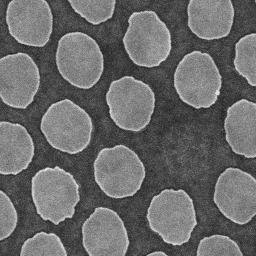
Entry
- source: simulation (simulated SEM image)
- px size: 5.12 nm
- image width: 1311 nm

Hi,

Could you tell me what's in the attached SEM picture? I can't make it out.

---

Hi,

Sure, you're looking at a regular array of raised bodies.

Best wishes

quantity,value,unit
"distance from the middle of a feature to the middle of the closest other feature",338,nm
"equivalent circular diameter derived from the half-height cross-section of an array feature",260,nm